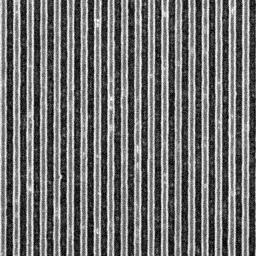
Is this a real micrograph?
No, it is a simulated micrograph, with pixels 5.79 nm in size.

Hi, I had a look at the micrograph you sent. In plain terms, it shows parallel lines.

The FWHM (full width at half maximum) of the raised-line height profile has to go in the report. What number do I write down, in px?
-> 6.01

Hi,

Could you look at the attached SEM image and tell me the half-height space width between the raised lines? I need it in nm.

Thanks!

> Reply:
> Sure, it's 44.2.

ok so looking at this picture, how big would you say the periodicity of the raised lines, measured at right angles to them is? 78 nanometres